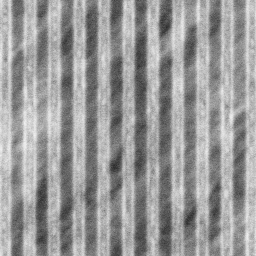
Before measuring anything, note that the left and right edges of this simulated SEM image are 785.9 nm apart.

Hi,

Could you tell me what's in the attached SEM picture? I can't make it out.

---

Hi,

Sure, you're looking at parallel lines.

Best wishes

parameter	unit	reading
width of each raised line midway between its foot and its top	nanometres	53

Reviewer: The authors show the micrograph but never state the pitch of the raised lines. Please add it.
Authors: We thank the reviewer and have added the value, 0.0758 microns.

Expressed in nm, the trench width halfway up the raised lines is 22.6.